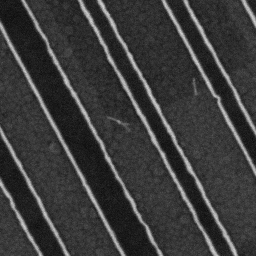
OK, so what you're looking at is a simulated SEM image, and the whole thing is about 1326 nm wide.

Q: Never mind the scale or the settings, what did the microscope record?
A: one or a few lines or trenches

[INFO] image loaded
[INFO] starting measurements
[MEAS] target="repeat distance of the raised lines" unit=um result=0.388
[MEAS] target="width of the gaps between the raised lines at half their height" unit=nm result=251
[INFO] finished